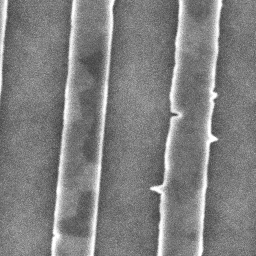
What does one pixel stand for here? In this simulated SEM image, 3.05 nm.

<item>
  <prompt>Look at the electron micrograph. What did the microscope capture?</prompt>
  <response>one or a few lines or trenches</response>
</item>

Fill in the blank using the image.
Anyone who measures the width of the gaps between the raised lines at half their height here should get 201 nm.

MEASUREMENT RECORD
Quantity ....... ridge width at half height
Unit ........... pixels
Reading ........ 40.1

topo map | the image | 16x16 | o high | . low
.....oo....ooo..
....ooo....ooo..
....ooo....ooo..
....ooo....ooo..
....ooo....oo...
....ooo....oo...
....ooo....oo...
....ooo....oo...
....oo.....oo...
....oo....ooo...
....oo....ooo...
....oo....ooo...
....oo....ooo...
...ooo....ooo...
...ooo....ooo...
...ooo....ooo...